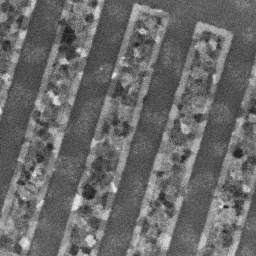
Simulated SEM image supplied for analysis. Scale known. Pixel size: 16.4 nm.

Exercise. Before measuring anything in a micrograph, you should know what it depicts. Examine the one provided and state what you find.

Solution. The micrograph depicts one or a few lines or trenches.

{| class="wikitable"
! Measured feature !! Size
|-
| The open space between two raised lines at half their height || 575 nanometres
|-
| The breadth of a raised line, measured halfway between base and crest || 510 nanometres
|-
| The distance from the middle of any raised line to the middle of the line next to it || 1070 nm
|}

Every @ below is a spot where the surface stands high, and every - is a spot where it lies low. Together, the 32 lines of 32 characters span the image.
@@@@-----@@@--------------------
@@@@----@@@@-----@@-------------
@@@-----@@@@-----@@@@-----------
@@@-----@@@@----@@@@-----@------
@@@----@@@@-----@@@@-----@@@----
@@-----@@@@-----@@@@----@@@@----
@@-----@@@@----@@@@-----@@@@----
@@----@@@@-----@@@@-----@@@@----
@-----@@@@-----@@@@----@@@@-----
@-----@@@@----@@@@-----@@@@-----
@-----@@@-----@@@@-----@@@@----@
@----@@@@-----@@@@----@@@@@----@
-----@@@@-----@@@@----@@@@-----@
-----@@@@----@@@@-----@@@@----@@
----@@@@-----@@@@-----@@@@----@@
----@@@@-----@@@@----@@@@-----@@
----@@@@----@@@@-----@@@@-----@@
---@@@@-----@@@@-----@@@@----@@@
---@@@@-----@@@@----@@@@-----@@@
---@@@@----@@@@-----@@@@-----@@@
---@@@-----@@@@-----@@@@----@@@@
--@@@@-----@@@@----@@@@-----@@@@
--@@@@-----@@@@----@@@@-----@@@@
--@@@-----@@@@-----@@@@----@@@@-
-@@@@-----@@@@-----@@@@----@@@@-
-@@@@-----@@@@----@@@@-----@@@@-
-@@@@----@@@@-----@@@@-----@@@--
@@@@-----@@@@-----@@@@----@@@@--
@@@@-----@@@@----@@@@-----@@@@--
@@@@----@@@@-----@@@@-----@@@@--
@@@-----@@@@-----@@@@----@@@@---
@@@-----@@@@----@@@@-----@@@@---